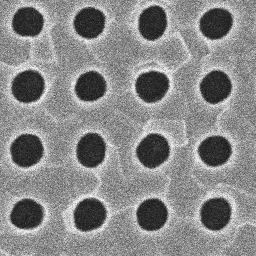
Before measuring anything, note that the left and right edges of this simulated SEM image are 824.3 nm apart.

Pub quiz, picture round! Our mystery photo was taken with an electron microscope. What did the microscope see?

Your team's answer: a regular array of holes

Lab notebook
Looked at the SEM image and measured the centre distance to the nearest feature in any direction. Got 201 nanometres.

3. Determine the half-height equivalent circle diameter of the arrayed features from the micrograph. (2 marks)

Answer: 106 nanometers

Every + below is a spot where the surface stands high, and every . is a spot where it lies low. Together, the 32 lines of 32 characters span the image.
++++++++++++++++++++++++++++++++
++...+++++...+++++...+++++...+++
++...++++....++++....++++....+++
++...++++....++++....++++....+++
+++.++++++..++++++..++++++..++++
++++++++++++++++++++++++++++++++
++++++++++++++++++++++++++++++++
++++++++++++++++++++++++++++++++
++++++++++++++++++++++++++++++++
++...+++++...++++....+++++..++++
+.....+++....++++....++++....+++
+....++++....++++....++++....+++
++...+++++..++++++..++++++..++++
++++++++++++++++++++++++++++++++
++++++++++++++++++++++++++++++++
++++++++++++++++++++++++++++++++
++++++++++++++++++++++++++++++++
++...+++++...+++++...+++++..++++
+....+++++...++++....++++....+++
+....+++++...++++....++++....+++
++..++++++...+++++..++++++..++++
++++++++++++++++++++++++++++++++
++++++++++++++++++++++++++++++++
++++++++++++++++++++++++++++++++
++++++++++++++++++++++++++++++++
++...+++++...+++++...++++....+++
+....++++....++++....++++....+++
+....++++....++++....++++....+++
++..++++++..++++++..++++++..++++
++++++++++++++++++++++++++++++++
++++++++++++++++++++++++++++++++
++++++++++++++++++++++++++++++++